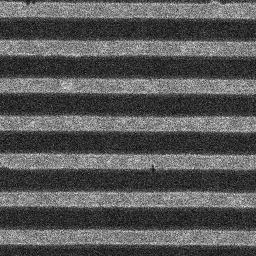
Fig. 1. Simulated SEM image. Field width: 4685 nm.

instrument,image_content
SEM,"parallel lines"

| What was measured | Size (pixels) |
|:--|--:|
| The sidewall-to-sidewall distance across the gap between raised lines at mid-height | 21.7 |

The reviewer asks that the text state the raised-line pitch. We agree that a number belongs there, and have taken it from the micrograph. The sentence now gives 692 nm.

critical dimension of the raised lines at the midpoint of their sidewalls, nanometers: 309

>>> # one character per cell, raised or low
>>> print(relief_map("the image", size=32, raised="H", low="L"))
HHHHHHHHHHHHHHHHHHHHHHHHHHHHHHHH
HHHHHHHHHHHHHHHHHHHHHHHHHHHHHHHH
LLLLLLLLLLLLLLLLLLLLLLLLLLLLLLLL
LLLLLLLLLLLLLLLLLLLLLLLLLLLLLLLL
LLLLLLLLLLLLLLLLLLLLLLLLLLLLLLLL
HHHHHHHHHHHHHHHHHHHHHHHHHHHHHHHH
HHHHHHHHHHHHHHHHHHHHHHHHHHHHHHHH
LLLLLLLLLLLLLLLLLLLLLLLLLLLLLLLL
LLLLLLLLLLLLLLLLLLLLLLLLLLLLLLLL
LLLLLLLLLLLLLLLLLLLLLLLLLLLLLLLL
HHHHHHHHHHHHHHHHHHHHHHHHHHHHHHHH
HHHHHHHHHHHHHHHHHHHHHHHHHHHHHHHH
LLLLLLLLLLLLLLLLLLLLLLLLLLLLLLLL
LLLLLLLLLLLLLLLLLLLLLLLLLLLLLLLL
HHHHHHHHHHHLLLLLLLLLLLLLLLHHLHHL
HHHHHHHHHHHHHHHHHHHHHHHHHHHHHHHH
LLLLLLLLLLLLLLLLLHHHLLLLLLHHHHHH
LLLLLLLLLLLLLLLLLLLLLLLLLLLLLLLL
LLLLLLLLLLLLLLLLLLLLLLLLLLLLLLLL
HHHHHHHHHHHHHHHHHHHHHHHHHHHHHHHH
HHHHHHHHHHHHHHHHHHHHHHHHHHHHHHHH
LLLLLLLLLLLLLLLLLLLLLLLLLLLLLLLL
LLLLLLLLLLLLLLLLLLLLLLLLLLLLLLLL
LLLLLLLLLLLLLLLLLLLLLLLLLLLLLLLL
HHHHHHHHHHHHHHHHHHHHHHHHHHHHHHHH
HHHHHHHHHHHHHHHHHHHHHHHHHHHHHHHH
LLLLLLLLLLLLLLLLLLLLLLLLLLLLLLLL
LLLLLLLLLLLLLLLLLLLLLLLLLLLLLLLL
LLLLLLLLLLLLLLLLLLLLLLLLLLLLLLLL
HHHHHHHHHHHHHHHHHHHHHHHHHHHHHHHH
HHHHHHHHHHHHHHHHHHHHHHHHHHHHHHHH
LLLLLLLLLLLLLLLLLLLLLLLLLLLLLLLL